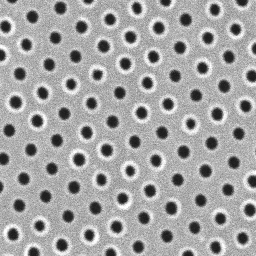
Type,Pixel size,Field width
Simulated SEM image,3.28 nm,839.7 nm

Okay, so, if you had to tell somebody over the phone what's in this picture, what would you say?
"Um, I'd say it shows a regular array of holes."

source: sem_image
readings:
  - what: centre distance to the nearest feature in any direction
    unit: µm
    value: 0.0921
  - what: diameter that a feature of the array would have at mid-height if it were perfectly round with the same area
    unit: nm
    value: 40.2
